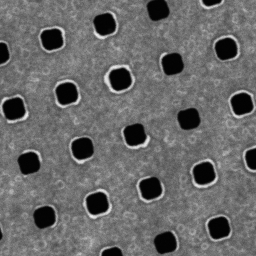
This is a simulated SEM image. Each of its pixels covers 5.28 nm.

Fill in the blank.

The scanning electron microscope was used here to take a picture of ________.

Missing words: a regular array of holes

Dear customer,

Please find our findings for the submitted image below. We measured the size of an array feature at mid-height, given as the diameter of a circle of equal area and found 120 nm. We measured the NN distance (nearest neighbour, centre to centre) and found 291 nm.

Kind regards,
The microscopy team